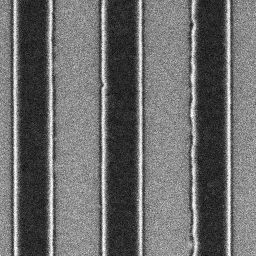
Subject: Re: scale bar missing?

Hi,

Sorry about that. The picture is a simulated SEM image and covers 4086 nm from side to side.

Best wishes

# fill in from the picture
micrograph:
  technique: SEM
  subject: one or a few lines or trenches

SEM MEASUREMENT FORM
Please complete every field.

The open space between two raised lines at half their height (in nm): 818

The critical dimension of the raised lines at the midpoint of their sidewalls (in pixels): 37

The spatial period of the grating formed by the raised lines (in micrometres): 1.42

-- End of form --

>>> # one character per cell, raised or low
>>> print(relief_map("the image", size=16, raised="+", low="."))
.++...+++...++..
.++...+++...++..
.++...+++...++..
.++...+++...++..
.++...+++...++..
.++...+++...++..
.++...+++...++..
.++...+++...++..
.++...+++...++..
.++...+++...++..
.++...+++...++..
.++...+++...++..
.++...+++...++..
.++...+++...++..
.++...+++...++..
.++...+++...++..